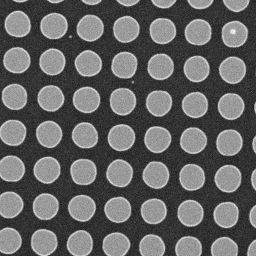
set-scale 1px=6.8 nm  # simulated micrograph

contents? an array of small figures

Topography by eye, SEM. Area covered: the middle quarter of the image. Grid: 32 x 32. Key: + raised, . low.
...++++++...++++++...++++++...++
...++++++...++++++...++++++...++
....++++.....+++++...++++++...++
......................++++.....+
................................
................................
....++++.....+++................
...++++++...+++++....+++++.....+
..+++++++...++++++...++++++...++
..+++++++...++++++...++++++...++
...++++++...++++++...++++++...++
....++++....+++++....+++++....++
..............++......+++......+
................................
................................
...++++......+++................
..++++++....+++++....++++......+
..++++++...+++++++...+++++....++
..++++++...+++++++..+++++++..+++
...+++++...++++++...+++++++..+++
....+++.....+++++....+++++...+++
.............++......++++.....++
................................
................................
...++++.....++++................
..++++++...++++++....++++.....++
..++++++...++++++...++++++...+++
..++++++...++++++...++++++...+++
..++++++...++++++...++++++...+++
...++++....+++++....++++++...+++
.............++......++++.....++
................................